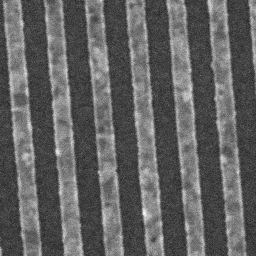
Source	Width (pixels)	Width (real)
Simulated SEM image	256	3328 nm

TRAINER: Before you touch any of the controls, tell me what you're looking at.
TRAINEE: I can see parallel lines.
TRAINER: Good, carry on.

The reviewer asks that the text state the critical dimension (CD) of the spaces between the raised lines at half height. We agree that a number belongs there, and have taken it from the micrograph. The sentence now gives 0.311 micrometres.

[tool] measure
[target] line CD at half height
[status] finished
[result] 220 nm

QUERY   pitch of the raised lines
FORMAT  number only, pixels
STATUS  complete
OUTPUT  40.9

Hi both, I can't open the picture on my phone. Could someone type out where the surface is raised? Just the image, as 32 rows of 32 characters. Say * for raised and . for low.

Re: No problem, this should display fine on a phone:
***...**...**...**...**...**...*
.**...**...**...**...**...**...*
.**...**...**...**...**...**...*
.**...**...**...**...**...**...*
.**...**...**...**...**...***...
.**...**...**...**...**...***...
.**...**...**...**...***...**...
.**...**...**...***...**...**...
.**...**...**...***...**...**...
.**...**...***...**...**...**...
.**...**....**...**...**...**...
.**....**...**...**...**...**...
.***...**...**...**...**...**...
..**...**...**...**...**...**...
..**...**...**...**...**...**...
..**...**...**...**...**...**...
..**...**...**...**...**...**...
..**...**...**...**...**...***..
..**...**...**...**...***...**..
..**...**...**...**...***...**..
..**...**...***..***...**...**..
..**...**...**...***...**...**..
..**...**....**...**...**...**..
..**....**...**...**...**...**..
..***...**...**...**...**...**..
...**...**...**...**...**...**..
...**...**...**...**...**...**..
...**...**...**...**...**...**..
...**...**...**...**...**...**..
...**...**...**...**...**...***.
...**...**...**...**...***..***.
...**...**...**...**....**...**.